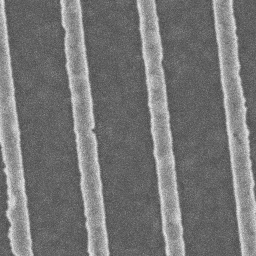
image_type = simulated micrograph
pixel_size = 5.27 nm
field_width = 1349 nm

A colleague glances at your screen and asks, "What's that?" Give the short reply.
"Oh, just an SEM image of one or a few lines or trenches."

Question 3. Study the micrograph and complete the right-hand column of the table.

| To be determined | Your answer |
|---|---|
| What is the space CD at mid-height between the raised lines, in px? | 57.6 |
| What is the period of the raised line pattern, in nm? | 399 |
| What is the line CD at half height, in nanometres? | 94.9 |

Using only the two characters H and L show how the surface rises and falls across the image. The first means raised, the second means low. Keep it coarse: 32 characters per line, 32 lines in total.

LLLLLLLLHHLLLLLLLHHLLLLLLLLHHLLL
LLLLLLLLHHLLLLLLLHHLLLLLLLLHHLLL
HLLLLLLLHHLLLLLLLLHHLLLLLLLHHLLL
HLLLLLLLHHLLLLLLLLHHLLLLLLLHHLLL
HLLLLLLLHHLLLLLLLLHHLLLLLLLHHLLL
HLLLLLLLHHLLLLLLLLHHLLLLLLLHHHLL
HLLLLLLLHHHLLLLLLLHHLLLLLLLHHHLL
HLLLLLLLHHHLLLLLLLHHLLLLLLLLHHLL
HLLLLLLLHHHLLLLLLLHHLLLLLLLLHHLL
HLLLLLLLLHHLLLLLLLHHLLLLLLLLHHLL
HHLLLLLLLHHLLLLLLLHHHLLLLLLLHHLL
HHLLLLLLLHHLLLLLLLLHHLLLLLLLHHLL
HHLLLLLLLHHLLLLLLLLHHLLLLLLLHHHL
HHLLLLLLLHHLLLLLLLLHHLLLLLLLHHHL
HHLLLLLLLHHHLLLLLLLHHLLLLLLLHHHL
HHLLLLLLLHHHLLLLLLLHHLLLLLLLHHHL
HHLLLLLLLHHLLLLLLLLHHLLLLLLLHHHL
HHLLLLLLLLHHLLLLLLLHHLLLLLLLLHHL
HHLLLLLLLLHHLLLLLLLHHLLLLLLLLHHL
HHHLLLLLLLHHLLLLLLLHHHLLLLLLLHHL
LHHLLLLLLLHHLLLLLLLLHHLLLLLLLHHL
LHHLLLLLLLHHLLLLLLLLHHLLLLLLLHHL
LHHLLLLLLLHHHLLLLLLLHHLLLLLLLHHH
LHHLLLLLLLHHHLLLLLLLHHLLLLLLLHHH
LHHLLLLLLLHHHLLLLLLLHHLLLLLLLHHH
LHHLLLLLLLLHHLLLLLLLHHLLLLLLLLHH
LHHLLLLLLLLHHLLLLLLLHHLLLLLLLLHH
LHHHLLLLLLLHHLLLLLLLHHHLLLLLLLHH
LHHHLLLLLLLHHLLLLLLLHHHLLLLLLLHH
LHHHLLLLLLLHHLLLLLLLLHHLLLLLLLHH
LHHHLLLLLLLHHLLLLLLLLHHLLLLLLLHH
LLHHLLLLLLLHHLLLLLLLLHHLLLLLLLHH